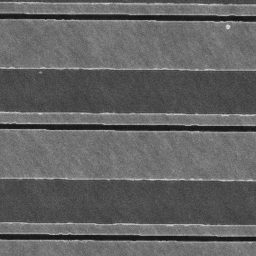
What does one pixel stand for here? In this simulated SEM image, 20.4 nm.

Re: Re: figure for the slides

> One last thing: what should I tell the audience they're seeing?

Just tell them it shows lines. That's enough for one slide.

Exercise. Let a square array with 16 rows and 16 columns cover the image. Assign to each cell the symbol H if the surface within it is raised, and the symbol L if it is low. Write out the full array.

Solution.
HHHHHHHHHHHHHHHH
HHHHHHHHHHHHHHHH
HHHHHHHHHHHHHHHH
HHHHHHHHHHHHHHHH
LLLLLLLLLLLLLLLL
LLLLLLLLLLLLLLLL
LLLLLLLLLLLLLLLL
HHHHHHHHHHHHHHHH
HHHHHHHHHHHHHHHH
HHHHHHHHHHHHHHHH
HHHHHHHHHHHHHHHH
LLLLLLLLLLLLLLLL
LLLLLLLLLLLLLLLL
LLLLLLLLLLLLLLLL
HHHHHHHHHHHHHHHH
HHHHHHHHHHHHHHHH